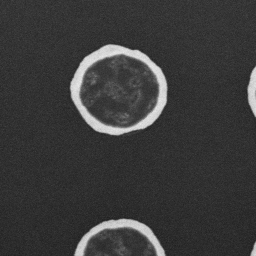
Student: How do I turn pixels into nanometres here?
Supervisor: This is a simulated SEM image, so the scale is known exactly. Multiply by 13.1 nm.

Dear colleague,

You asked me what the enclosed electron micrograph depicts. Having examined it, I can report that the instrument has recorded raised bodies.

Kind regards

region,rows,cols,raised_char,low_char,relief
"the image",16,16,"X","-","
----------------
----------------
----------------
------XXX-------
-----XXXXX------
-----XXXXX------
-----XXXXX------
------XXX-------
----------------
----------------
----------------
----------------
----------------
----------------
------XXX-------
-----XXXXX------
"